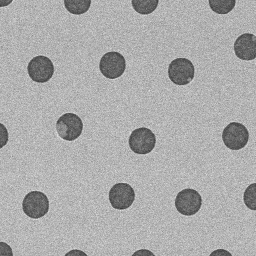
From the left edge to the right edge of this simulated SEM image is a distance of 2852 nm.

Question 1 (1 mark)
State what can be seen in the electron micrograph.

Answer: a regular array of holes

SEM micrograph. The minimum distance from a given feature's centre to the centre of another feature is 750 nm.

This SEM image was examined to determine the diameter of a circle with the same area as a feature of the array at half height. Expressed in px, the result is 27.2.